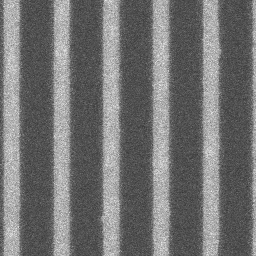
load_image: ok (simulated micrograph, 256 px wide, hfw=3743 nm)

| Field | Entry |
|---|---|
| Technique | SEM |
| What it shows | parallel lines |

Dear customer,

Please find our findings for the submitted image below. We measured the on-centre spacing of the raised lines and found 726 nm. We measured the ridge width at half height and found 0.523 um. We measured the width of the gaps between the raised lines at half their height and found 205 nm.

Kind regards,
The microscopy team